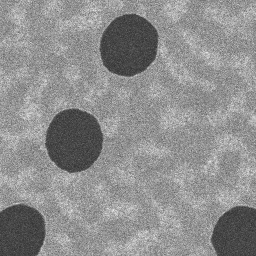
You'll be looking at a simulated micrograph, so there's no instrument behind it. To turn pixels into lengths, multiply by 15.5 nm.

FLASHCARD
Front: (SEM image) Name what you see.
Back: holes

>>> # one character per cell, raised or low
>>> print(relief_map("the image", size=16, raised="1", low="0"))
1111111111111111
1111111001111111
1111110000111111
1111110000111111
1111111001111111
1111111111111111
1111111111111111
1110001111111111
1110001111111111
1110001111111111
1111011111111111
1111111111111111
1111111111111111
0001111111111100
0001111111111000
0001111111111000